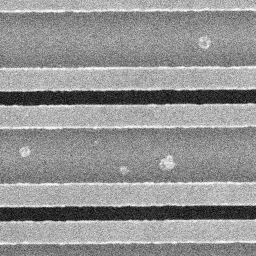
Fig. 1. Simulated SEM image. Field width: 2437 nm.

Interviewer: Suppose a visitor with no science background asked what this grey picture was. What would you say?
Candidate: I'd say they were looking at lines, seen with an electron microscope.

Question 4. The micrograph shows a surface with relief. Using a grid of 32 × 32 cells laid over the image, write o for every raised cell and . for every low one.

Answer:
oooooooooooooooooooooooooooooooo
................................
................................
................................
................................
................................
................................
................................
...................oo.oooooooooo
oooooooooooooooooooooooooooooooo
oooooooooooooooooooooooooooooooo
................................
................................
oooooooooooooooooooooooooooooooo
oooooooooooooooooooooooooooooooo
oooooooooooooooooooooooooooooooo
................................
................................
................................
................................
................................
................................
................................
oooooooooooooooooooooooooooooooo
oooooooooooooooooooooooooooooooo
oooooooooooooooooooooooooooooooo
................................
...............................o
oooooooooooooooooooooooooooooooo
oooooooooooooooooooooooooooooooo
................................
................................